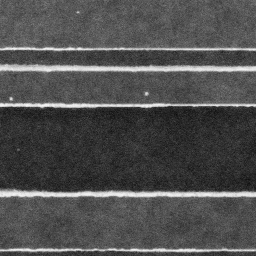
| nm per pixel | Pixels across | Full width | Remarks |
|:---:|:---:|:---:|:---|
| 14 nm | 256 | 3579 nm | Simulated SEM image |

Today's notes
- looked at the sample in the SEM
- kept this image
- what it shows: lines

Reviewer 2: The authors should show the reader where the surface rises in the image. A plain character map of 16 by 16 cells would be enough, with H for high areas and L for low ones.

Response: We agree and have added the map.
HHHHHHHHHHHHHHHH
HHHHHHHHHHHHHHHH
HHHHHHHHHHHHHHHH
HHHHHHHHHHHHHHHH
HHHHHHHHHHHHHHHH
HHHHHHHHHHHHHHHH
HHHHHHHHHHHHHHHH
LLLLLLLLLLLLLLLL
LLLLLLLLLLLLLLLL
LLLLLLLLLLLLLLLL
LLLLLLLLLLLLLLLL
LLLLLLLLLLLLLLLL
HHHHHHHHHHHHHHHH
HHHHHHHHHHHHHHHH
HHHHHHHHHHHHHHHH
HHHHHHHHHHHHHHHH